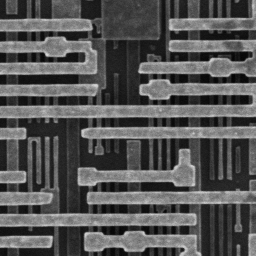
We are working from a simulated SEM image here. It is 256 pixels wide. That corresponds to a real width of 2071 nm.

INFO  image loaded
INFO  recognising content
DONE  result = wiring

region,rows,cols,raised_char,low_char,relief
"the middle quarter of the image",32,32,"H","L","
HHHHHHHHLLLLLLLLLLLHHHHHHHHHHHHH
HHHHHHHHLLLLLLLLLLLHHHHHHHHHHHHH
HHHHHHHHLLLLLLLLLLLLLLLLLLLLLLLL
LLLLLLLLLLLLLLLLLLLLLLLLLLLLLLLL
LLLLLLLLLLLLLLLLLLLLLHHHHHHLLLLL
HHHHHHHHLLLLLLLLLLLHHHHHHHHHHHHH
HHHHHHHHLLLLLLLLLLLHHHHHHHHHHHHH
HHHHHHHHLLLLLLLLLLLHHHHHHHHHHHHH
LLLLLLLLLLLLLLLLLLLLLHHHHHLLLLLL
LLLLLLLLLLLLLLLLLLLLLLLLLLLLLLLL
HHHHHHHHHHHHHHHHHHHHHHHHHHHHHHHH
HHHHHHHHHHHHHHHHHHHHHHHHHHHHHHHH
HHHHHHHHHHHHHHHHHHHHHHHHHHHHHHHH
LLLLLLLLLLLLLLLLLLLLLLLLLLLLLLLL
LLLLLLLLLLLLLLLLLLLLLLLLLLLLLLLL
LLLLLLLLLLLLLLLLLLLLLLLLLLLLLLLL
LLLLLHHHHHHHHHHHHHHHHHHHHHHHHHHH
LLLLHHHHHHHHHHHHHHHHHHHHHHHHHHHH
LLLLLHHHHHHHHHHHHHHHHHHHHHHHHHHH
LLLLLLLLLLLLLLLLLLLLLLLLLLLLLLLL
LLLLLLLLLLLLLLLLLLLLLLLLLLLLLLLL
LLLLLLLLLLLLLLLLLLLLLLLLLLLLLHHL
LLLLLLLLLLLLLLLLLLLLLLLLLLLLLHHH
LLLLLLLLLLLLLLLLLLLLLLLLLLLLLHHH
LLLLLLLLLLLLLLLLLLLLLLLLLLLLLHHH
LLLLLLLLLLLLLLLLLLLLLLLLLLLLHHHH
LLLHHHHHLLLLLLLLLLLLLLLLLLLHHHHH
LLLLHHHHHHHHHHHHHHHHHHHHHHHHHHHH
LLLLHHHHHHHHHHHHHHHHHHHHHHHHHHHH
LLLHHHHHHLLLLLLLLLLLLLLLLLLHHHHH
LLLLLLLLLLLLLLLLLLLLLLLLLLLLHHHH
LLLLLLLLLLLLLLLLLLLLLLLLLLLLLLLL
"